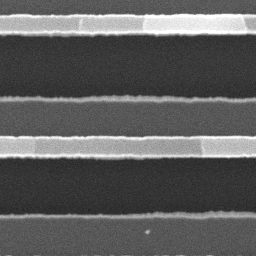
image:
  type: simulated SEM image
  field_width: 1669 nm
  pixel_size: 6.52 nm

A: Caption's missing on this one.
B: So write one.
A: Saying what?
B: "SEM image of lines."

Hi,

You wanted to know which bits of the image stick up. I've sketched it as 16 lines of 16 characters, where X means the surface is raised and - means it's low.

XXXXXXXXXXXXXXXX
XXXXXXXXXXXXXXXX
----------------
----------------
----------------
----------------
XXXXXXXXXXXXXXXX
XXXXXXXXXXXXXXXX
XXXXXXXXXXXXXXXX
XXXXXXXXXXXXXXXX
----------------
----------------
----------------
-XXXXXX-XXXXXXXX
XXXXXXXXXXXXXXXX
XXXXXXXXXXXXXXXX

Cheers